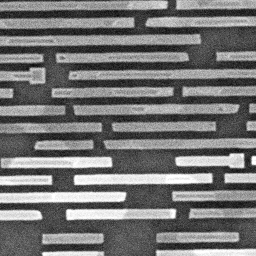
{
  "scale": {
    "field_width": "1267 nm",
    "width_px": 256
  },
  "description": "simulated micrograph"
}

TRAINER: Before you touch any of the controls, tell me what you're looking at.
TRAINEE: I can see wiring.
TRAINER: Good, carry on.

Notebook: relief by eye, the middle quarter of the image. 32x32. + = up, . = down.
................................
................................
.+++++++++++++++++++++++++++++++
.+++++++++++++++++++++++++++++++
................................
................................
+++++++++++++++++++++++++++...++
+++++++++++++++++++++++++++...++
................................
................................
............++++++++++++++++++++
...+++++++++++++++++++++++++++++
...++++++++++++++++++...........
................................
................................
+++++++++...++++++++++++++++++++
+++++++++...++++++++++++++++++++
................................
................................
+++++++...++++++++++++++++++++++
+++++++...++++++++++++++++++++++
................................
................................
.............................+++
++++++++++++................++++
++++++++++++....................
................................
................................
...+++++++++++++++++++++++++++++
...+++++++++++++++++++++++++++++
................................
................................